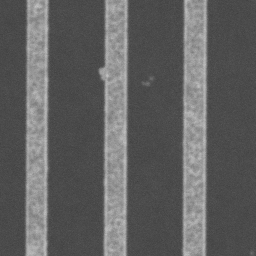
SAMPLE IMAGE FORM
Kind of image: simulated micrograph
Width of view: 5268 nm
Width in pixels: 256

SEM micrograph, one or a few lines or trenches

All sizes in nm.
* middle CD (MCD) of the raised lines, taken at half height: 399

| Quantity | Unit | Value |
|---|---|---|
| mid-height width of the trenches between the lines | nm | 1230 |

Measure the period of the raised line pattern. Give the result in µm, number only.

1.63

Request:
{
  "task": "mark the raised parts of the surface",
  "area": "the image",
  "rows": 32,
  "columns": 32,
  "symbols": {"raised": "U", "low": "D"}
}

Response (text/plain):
DDDDUUDDDDDDDUUUDDDDDDDUUUDDDDDD
DDDDUUDDDDDDDUUUDDDDDDDUUUDDDDDD
DDDDUUDDDDDDDUUUDDDDDDDUUUDDDDDD
DDDDUUDDDDDDDUUUDDDDDDDUUUDDDDDD
DDDDUUDDDDDDDUUUDDDDDDDUUUDDDDDD
DDDDUUDDDDDDDUUUDDDDDDDUUUDDDDDD
DDDDUUDDDDDDDUUUDDDDDDDUUUDDDDDD
DDDDUUDDDDDDDUUUDDDDDDDUUUDDDDDD
DDDUUUDDDDDDDUUUDDDDDDDUUUDDDDDD
DDDDUUDDDDDDDUUUDDDDDDDUUUDDDDDD
DDDDUUDDDDDDDUUUDDDDDDDUUUDDDDDD
DDDUUUDDDDDDDUUUDDDDDDDUUUDDDDDD
DDDUUUDDDDDDDUUUDDDDDDDUUUDDDDDD
DDDDUUDDDDDDDUUUDDDDDDDUUUDDDDDD
DDDDUUDDDDDDDUUUDDDDDDDUUUDDDDDD
DDDUUUDDDDDDDUUUDDDDDDDUUUDDDDDD
DDDUUUDDDDDDDUUUDDDDDDDUUUDDDDDD
DDDUUUDDDDDDDUUUDDDDDDDUUUDDDDDD
DDDDUUDDDDDDDUUUDDDDDDDUUUDDDDDD
DDDDUUDDDDDDDUUUDDDDDDDUUDDDDDDD
DDDDUUDDDDDDDUUUDDDDDDDUUDDDDDDD
DDDDUUDDDDDDDUUUDDDDDDDUUDDDDDDD
DDDDUUDDDDDDDUUUDDDDDDDUUDDDDDDD
DDDDUUDDDDDDDUUUDDDDDDDUUDDDDDDD
DDDDUUDDDDDDDUUUDDDDDDDUUDDDDDDD
DDDUUUDDDDDDDUUUDDDDDDDUUDDDDDDD
DDDUUUDDDDDDDUUUDDDDDDDUUDDDDDDD
DDDDUUDDDDDDDUUUDDDDDDDUUDDDDDDD
DDDDUUDDDDDDDUUUDDDDDDDUUDDDDDDD
DDDUUUDDDDDDDUUUDDDDDDDUUDDDDDDD
DDDUUUDDDDDDDUUUDDDDDDDUUDDDDDDD
DDDUUUDDDDDDDUUUDDDDDDDUUDDDDDDD